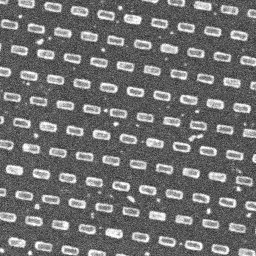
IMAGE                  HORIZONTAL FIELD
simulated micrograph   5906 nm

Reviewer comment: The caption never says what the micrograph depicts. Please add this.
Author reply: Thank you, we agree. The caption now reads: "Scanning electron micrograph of a regular array of raised bodies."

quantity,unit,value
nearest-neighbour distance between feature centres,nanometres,618